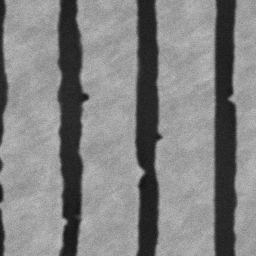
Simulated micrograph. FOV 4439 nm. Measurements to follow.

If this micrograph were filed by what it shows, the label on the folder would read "one or a few lines or trenches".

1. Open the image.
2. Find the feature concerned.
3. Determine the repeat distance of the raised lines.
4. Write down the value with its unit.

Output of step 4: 1330 nm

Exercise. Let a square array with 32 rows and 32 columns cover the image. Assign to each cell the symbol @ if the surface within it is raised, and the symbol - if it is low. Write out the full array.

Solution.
-@@@@@@@--@@@@@@@--@@@@@@@@--@@@
-@@@@@@---@@@@@@@--@@@@@@@@--@@@
@@@@@@@---@@@@@@@---@@@@@@@--@@@
@@@@@@@---@@@@@@@---@@@@@@@--@@@
@@@@@@@---@@@@@@@---@@@@@@@--@@@
@@@@@@@---@@@@@@@---@@@@@@@--@@@
@@@@@@@---@@@@@@@---@@@@@@@--@@@
@@@@@@@---@@@@@@@---@@@@@@@--@@@
-@@@@@@---@@@@@@@---@@@@@@@--@@@
-@@@@@@@--@@@@@@@---@@@@@@@--@@@
-@@@@@@@--@@@@@@@---@@@@@@@--@@@
-@@@@@@----@@@@@@---@@@@@@@--@@@
-@@@@@@----@@@@@@---@@@@@@@--@@@
-@@@@@@@--@@@@@@@---@@@@@@@--@@@
@@@@@@@@--@@@@@@@---@@@@@@@---@@
@@@@@@@@--@@@@@@@---@@@@@@@---@@
@@@@@@@---@@@@@@@---@@@@@@@---@@
@@@@@@@---@@@@@@@---@@@@@@@---@@
@@@@@@@---@@@@@@@--@@@@@@@@---@@
@@@@@@@---@@@@@@@--@@@@@@@@---@@
@@@@@@@@--@@@@@@@--@@@@@@@@---@@
@@@@@@@@--@@@@@@@@-@@@@@@@@---@@
@@@@@@@@--@@@@@@@@--@@@@@@@--@@@
@@@@@@@@--@@@@@@@---@@@@@@@--@@@
@@@@@@@@--@@@@@@@---@@@@@@@---@@
@@@@@@@@--@@@@@@@@--@@@@@@@---@@
@@@@@@@@--@@@@@@@---@@@@@@@--@@@
@@@@@@@@--@@@@@@@---@@@@@@@--@@@
@@@@@@@@--@@@@@@@---@@@@@@@--@@@
-@@@@@@@--@@@@@@@---@@@@@@@--@@@
-@@@@@@@--@@@@@@@---@@@@@@@--@@@
-@@@@@@@-@@@@@@@@--@@@@@@@@--@@@